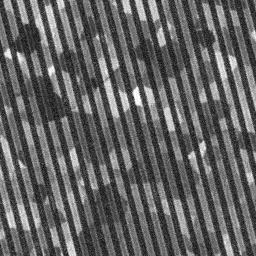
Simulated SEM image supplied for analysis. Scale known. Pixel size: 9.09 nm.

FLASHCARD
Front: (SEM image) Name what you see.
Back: parallel lines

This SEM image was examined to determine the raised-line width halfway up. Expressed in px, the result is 5.57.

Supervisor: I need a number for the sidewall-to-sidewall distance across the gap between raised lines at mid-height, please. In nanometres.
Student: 67.2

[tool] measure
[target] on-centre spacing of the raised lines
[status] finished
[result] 116 nm